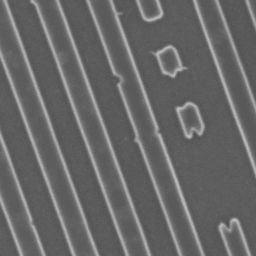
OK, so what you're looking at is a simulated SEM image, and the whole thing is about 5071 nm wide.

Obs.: parallel lines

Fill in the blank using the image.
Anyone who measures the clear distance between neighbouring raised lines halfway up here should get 556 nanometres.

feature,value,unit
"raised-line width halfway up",435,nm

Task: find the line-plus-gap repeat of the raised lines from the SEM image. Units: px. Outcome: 49.5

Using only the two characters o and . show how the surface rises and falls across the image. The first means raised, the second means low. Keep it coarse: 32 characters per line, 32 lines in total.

o...ooo....ooo...ooo....ooo....o
o....ooo....ooo...oo.....ooo...o
oo...ooo....ooo..........ooo....
oo....oo....ooo..........ooo....
oo....ooo....ooo..........ooo...
ooo...ooo....ooo..........ooo...
ooo....ooo...ooo....oo.....oo...
ooo....ooo....ooo...oo.....ooo..
.ooo...ooo....ooo...oo.....ooo..
.ooo....ooo....oo...........ooo.
.ooo....ooo....ooo..........ooo.
..ooo...ooo....ooo..........ooo.
..ooo....ooo...ooo...........ooo
...ooo...ooo....ooo....oo....ooo
...ooo....oo....ooo...ooo....ooo
...ooo....ooo....oo....oo.....oo
....ooo...ooo....ooo...o......oo
....ooo....ooo...ooo...........o
o...ooo....ooo....oo...........o
o....ooo...ooo....ooo..........o
o....ooo....ooo...ooo...........
oo...ooo....ooo....ooo..........
oo....ooo...ooo....ooo..........
oo....ooo....ooo...ooo..........
ooo....ooo...ooo....ooo.........
ooo....ooo....oo....ooo.........
.oo....ooo....ooo....oo.........
.ooo....ooo...ooo....ooo........
.ooo....ooo....ooo...ooo....oo..
..ooo...ooo....ooo....ooo...oo..
..ooo....ooo...ooo....ooo...ooo.
..ooo....ooo....ooo...ooo....oo.